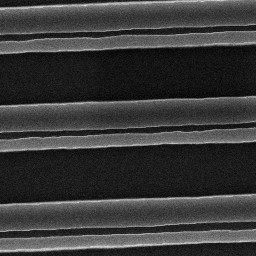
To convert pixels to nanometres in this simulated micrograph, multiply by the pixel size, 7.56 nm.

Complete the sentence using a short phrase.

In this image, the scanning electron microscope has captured lines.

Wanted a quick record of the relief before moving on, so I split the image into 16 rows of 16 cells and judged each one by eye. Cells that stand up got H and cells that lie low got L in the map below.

LHHHHHHHHHHHHHHH
HHHHHHHHHHHHHHHH
HHHHHHHHHHHHHHHH
LLLLLLLLLLLLLLLL
LLLLLLLLLLLLLLLL
LLLLLLLLLLLLLLLL
LLLLHHHHHHHHHHHH
HHHHHHHHHHHHHHHH
HHHHHHHHHHHHHHHH
LLLLLLLLLLLLLLLL
LLLLLLLLLLLLLLLL
LLLLLLLLLLLLLLLL
LLLLLLLLHHHHHHHH
HHHHHHHHHHHHHHHH
HHHHHHHHHHHHHHHH
HHHHLLLLLLLLLLLL